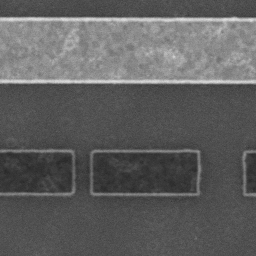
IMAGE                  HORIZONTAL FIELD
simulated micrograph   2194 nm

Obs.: one or a few lines or trenches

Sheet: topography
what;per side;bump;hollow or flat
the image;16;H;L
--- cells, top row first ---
LLLLLLLLLLLLLLLL
HHHHHHHHHHHHHHHH
HHHHHHHHHHHHHHHH
HHHHHHHHHHHHHHHH
HHHHHHHHHHHHHHHH
LLLLLLLLLLLLLLLL
LLLLLLLLLLLLLLLL
LLLLLLLLLLLLLLLL
LLLLLLLLLLLLLLLL
HHHHLLHHHHHHLLLL
HHHHHLHHHHHHLLLH
HHHHHLHHHHHHLLLH
LLLLLLLLLLLLLLLL
LLLLLLLLLLLLLLLL
LLLLLLLLLLLLLLLL
LLLLLLLLLLLLLLLL